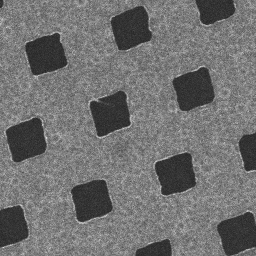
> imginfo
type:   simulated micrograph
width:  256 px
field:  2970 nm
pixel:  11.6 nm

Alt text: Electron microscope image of holes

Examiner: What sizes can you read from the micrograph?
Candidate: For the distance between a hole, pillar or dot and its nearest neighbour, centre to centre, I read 87.4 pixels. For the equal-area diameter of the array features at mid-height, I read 476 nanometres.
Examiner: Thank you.